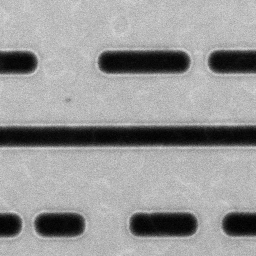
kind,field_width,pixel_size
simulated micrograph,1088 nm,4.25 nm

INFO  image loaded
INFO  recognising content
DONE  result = one or a few lines or trenches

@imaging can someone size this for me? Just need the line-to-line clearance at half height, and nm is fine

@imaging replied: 265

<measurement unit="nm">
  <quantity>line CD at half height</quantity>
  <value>105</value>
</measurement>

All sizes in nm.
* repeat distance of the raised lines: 345